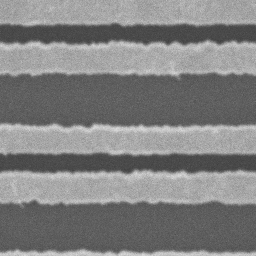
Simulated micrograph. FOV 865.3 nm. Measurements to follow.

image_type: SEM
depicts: lines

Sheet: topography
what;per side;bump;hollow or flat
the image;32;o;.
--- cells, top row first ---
oooooooooooooooooooooooooooooooo
oooooooooooooooooooooooooooooooo
oooooooooooooooooooooooooooooooo
................................
................................
oooooooo...ooooooo.oooo.ooo.oooo
oooooooooooooooooooooooooooooooo
oooooooooooooooooooooooooooooooo
oooooooooooooooooooooooooooooooo
................................
................................
................................
................................
................................
................................
................................
oooooooooooooooooooooooooooooooo
oooooooooooooooooooooooooooooooo
oooooooooooooooooooooooooooooooo
................................
................................
oooo...oo.o.ooo..oooo.o..o..oooo
oooooooooooooooooooooooooooooooo
oooooooooooooooooooooooooooooooo
oooooooooooooooooooooooooooooooo
................................
................................
................................
................................
................................
................................
.oooo.o.ooo....o....oo..oo......